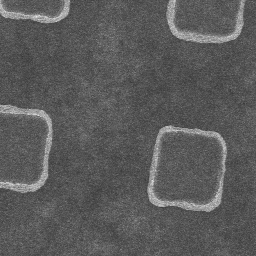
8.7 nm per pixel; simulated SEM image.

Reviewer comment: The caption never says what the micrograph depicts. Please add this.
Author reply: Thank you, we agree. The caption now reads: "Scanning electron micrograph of raised bodies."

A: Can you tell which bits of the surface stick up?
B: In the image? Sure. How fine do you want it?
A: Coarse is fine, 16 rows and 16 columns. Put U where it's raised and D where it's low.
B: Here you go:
UUUUDDDDDDDUUUUD
DDDDDDDDDDDUUUUD
DDDDDDDDDDDDDDDD
DDDDDDDDDDDDDDDD
DDDDDDDDDDDDDDDD
DDDDDDDDDDDDDDDD
DDDDDDDDDDDDDDDD
UUUDDDDDDDDDDDDD
UUUDDDDDDDUUUUDD
UUUDDDDDDDUUUUDD
UUUDDDDDDUUUUUDD
UUDDDDDDDUUUUUDD
DDDDDDDDDDUUUUDD
DDDDDDDDDDDDDDDD
DDDDDDDDDDDDDDDD
DDDDDDDDDDDDDDDD